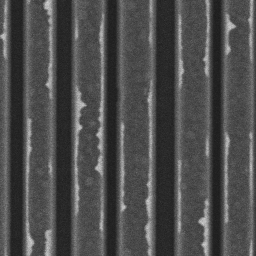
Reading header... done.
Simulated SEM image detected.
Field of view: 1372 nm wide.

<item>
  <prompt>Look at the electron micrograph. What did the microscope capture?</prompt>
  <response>parallel lines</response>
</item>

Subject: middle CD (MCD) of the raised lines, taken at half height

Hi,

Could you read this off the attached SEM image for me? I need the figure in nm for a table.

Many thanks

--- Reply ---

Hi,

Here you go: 170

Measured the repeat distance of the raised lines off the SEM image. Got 49.8 pixels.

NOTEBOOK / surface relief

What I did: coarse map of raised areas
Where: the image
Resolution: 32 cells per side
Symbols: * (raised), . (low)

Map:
*..****..****..****...****..****
*..****..****..****...****..****
*..****..****..****...****..****
*..****..****..****...****..****
*..****..****..****...****..****
*..****..****..****...****..****
*..****..****..****...****..****
*..****..****..****...****..****
*..****..****..****...****..****
*..****..****..****...****..****
*..****..****..****...****..****
*..****..****..****...****..****
*..****..****..****...****..****
*..****..****..****...****..****
*..****..****..****...****..****
*..****..****..****...****..****
*..****..****..****...****..****
*..****..****..****...****..****
*..****..****..****...****..****
*..****..****..****...****..****
*..****..****..****...****..****
*..****..****..****...****..****
*..****..****..****...****..****
*..****..****..****...****..****
*..****..****..****...****..****
*..****..****..****...****..****
*..****..****..****...****..****
*..****..****..****...****..****
*..****..****..****...****..****
*..****..****..****...****..****
*..****..****..****...****..****
*..****..****..****...****..****